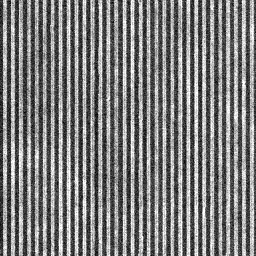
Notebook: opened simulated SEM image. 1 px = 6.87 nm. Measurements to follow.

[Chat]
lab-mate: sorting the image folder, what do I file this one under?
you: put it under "parallel lines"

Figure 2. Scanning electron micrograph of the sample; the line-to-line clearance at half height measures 33.5 nm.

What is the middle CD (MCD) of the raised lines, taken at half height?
20.6 nm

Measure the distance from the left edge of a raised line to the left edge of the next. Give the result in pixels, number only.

7.95